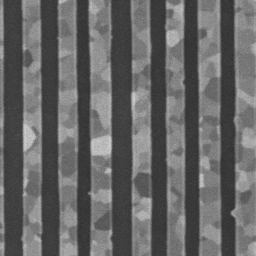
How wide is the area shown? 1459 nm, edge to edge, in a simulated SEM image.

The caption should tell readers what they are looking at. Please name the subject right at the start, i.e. parallel lines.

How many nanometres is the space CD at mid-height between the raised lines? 99.7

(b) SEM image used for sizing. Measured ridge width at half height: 97.5 nm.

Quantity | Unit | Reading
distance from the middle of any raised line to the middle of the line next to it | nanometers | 202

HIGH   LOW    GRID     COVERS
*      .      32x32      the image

...**..**..***...**..**..**...**
...**..**..***...**..**..**...**
...**..**..***...**..**..**...**
...**..**..***...**..**..**...**
...**..**..***...**..**..**...**
...**..**..***...**..**..**..***
...**..**..***...**..**..**..***
...**..**..***...**..**..**...**
...**..**..***...**..**..**...**
...**..**..***...**..**..**...**
...**..***..**...**..**..**...**
...**..***.***...**..**..**...**
...**..***.***...**..**..**...**
...**..***.***...**..**..**...**
...**..***.***...**..**..**..***
...**..***.***...**..**..**..***
...**..***.***...**..**..**...**
...**..***.***...**..**..**...**
...**..***.***...**..**..**...**
...**..***.***...**..**..**...**
...**..***.***...**..**..**...**
...**...**.***...**..**..**...**
...**...*..***...**..**..**...**
...**...*...**...**..**..**...**
...**...*...**...**..**..**...**
...**...*...**...**..**..**...**
...**...*...**...**..**..**..***
...**...*...**...**..**..**...**
...**...*...**...**..**..**...**
...**...*...**...**..**..**...**
...**...*...**...**..**..**...**
...**...**.***...**..**..**...**